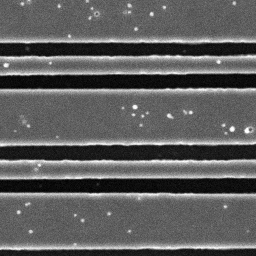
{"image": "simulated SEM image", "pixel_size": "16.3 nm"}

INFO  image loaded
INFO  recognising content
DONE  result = lines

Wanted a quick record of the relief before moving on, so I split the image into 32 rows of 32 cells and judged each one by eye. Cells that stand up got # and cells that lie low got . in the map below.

################################
################################
################################
################################
################################
................................
................................
################################
################################
................................
................................
################################
################################
################################
################################
################################
################################
################################
................................
................................
################################
################################
................................
................................
################################
################################
################################
################################
################################
################################
################################
................................